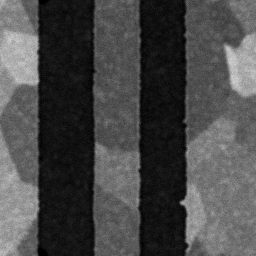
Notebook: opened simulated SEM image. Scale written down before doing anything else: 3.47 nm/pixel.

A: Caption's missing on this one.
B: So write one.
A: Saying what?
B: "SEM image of one or a few lines or trenches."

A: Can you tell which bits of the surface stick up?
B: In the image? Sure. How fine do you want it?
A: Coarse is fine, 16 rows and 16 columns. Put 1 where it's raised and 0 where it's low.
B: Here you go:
1100001110001111
1100001110001111
1100001110001111
1100001110001111
1100001110001111
1100001110001111
1100001110001111
1100001110001111
1100001110001111
1100001110001111
1100001110001111
1100001110001111
1100001110001111
1100001110001111
1100001110001111
1100001110001111